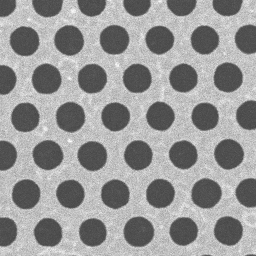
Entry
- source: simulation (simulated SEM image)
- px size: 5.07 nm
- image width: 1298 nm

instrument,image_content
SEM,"a regular array of holes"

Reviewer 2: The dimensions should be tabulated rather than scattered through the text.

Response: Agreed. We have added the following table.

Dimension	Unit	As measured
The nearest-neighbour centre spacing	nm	222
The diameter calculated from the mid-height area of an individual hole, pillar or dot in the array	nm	148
